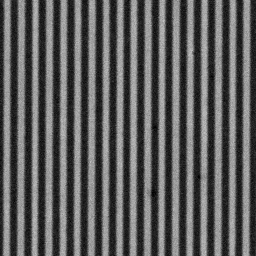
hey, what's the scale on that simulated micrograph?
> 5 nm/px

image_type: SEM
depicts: parallel lines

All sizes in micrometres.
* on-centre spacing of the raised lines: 0.0704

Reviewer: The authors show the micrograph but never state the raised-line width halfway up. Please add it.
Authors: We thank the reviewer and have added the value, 0.0312 microns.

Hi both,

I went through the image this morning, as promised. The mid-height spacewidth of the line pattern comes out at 40.6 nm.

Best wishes